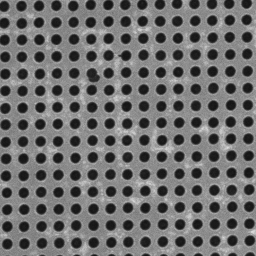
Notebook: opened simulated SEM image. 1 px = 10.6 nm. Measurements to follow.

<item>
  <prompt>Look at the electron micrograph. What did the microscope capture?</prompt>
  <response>a regular array of holes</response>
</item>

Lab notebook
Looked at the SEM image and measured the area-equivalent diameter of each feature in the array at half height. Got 110 nanometres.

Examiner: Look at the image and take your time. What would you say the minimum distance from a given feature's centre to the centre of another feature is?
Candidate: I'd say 176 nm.